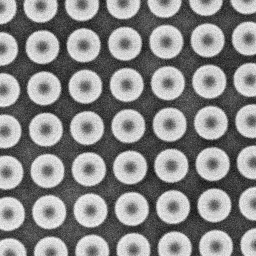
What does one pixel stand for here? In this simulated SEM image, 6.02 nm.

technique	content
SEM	an array of small figures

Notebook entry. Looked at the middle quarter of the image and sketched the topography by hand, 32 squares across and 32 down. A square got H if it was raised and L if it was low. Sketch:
LLLLLLLLLLLLLLLLLLLLLLLLLLLLLLLL
LLLLLLLLLLLLLLHHHLLLLLLLHHHHLLLL
LLLHHHHHLLLLLHHHHHHLLLLHHHHHHLLL
LLHHHHHHHLLLHHHHHHHLLLHHHHHHHHLL
LHHHHHHHHLLLHHHHHHHHLLHHHHHHHHLL
LHHHHHHHHLLLHHHHHHHHLLHHHHHHHHLL
LHHHHHHHHLLLHHHHHHHHLLHHHHHHHHLL
LLHHHHHHHLLLHHHHHHHLLLLHHHHHHLLL
LLHHHHHHLLLLLHHHHHLLLLLLHHHHLLLL
LLLLHHHLLLLLLLLLLLLLLLLLLLLLLLLL
LLLLLLLLLLLLLLLLLLLLLLLLLLLLLLLL
LLLLLLLLLLLLLLLLLLLLLLLLHHHHLLLL
LLLLHHHHLLLLLHHHHHHLLLLHHHHHHHLL
LLHHHHHHHLLLLHHHHHHHLLLHHHHHHHLL
LLHHHHHHHHLLHHHHHHHHLLHHHHHHHHLL
LLHHHHHHHHLLHHHHHHHHLLHHHHHHHHLL
LLHHHHHHHHLLHHHHHHHHLLLHHHHHHHLL
LLHHHHHHHHLLHHHHHHHHLLLHHHHHHHLL
LLLHHHHHHLLLLHHHHHHLLLLLHHHHHLLL
LLLLHHHHLLLLLLLHHLLLLLLLLLLLLLLL
LLLLLLLLLLLLLLLLLLLLLLLLLLLLLLLL
LLLLLLLLLLLLLLLLLLLLLLLLLLHHLLLL
LLLLLHHHLLLLLLHHHHHLLLLLHHHHHHLL
LLLHHHHHHLLLLHHHHHHHLLLHHHHHHHLL
LLLHHHHHHHLLLHHHHHHHLLLHHHHHHHHL
LLHHHHHHHHLLLHHHHHHHHLLHHHHHHHHL
LLHHHHHHHHLLLHHHHHHHHLLHHHHHHHHL
LLHHHHHHHHLLLHHHHHHHLLLHHHHHHHLL
LLLHHHHHHHLLLHHHHHHHLLLLHHHHHHLL
LLLLHHHHHLLLLLLHHHLLLLLLLLLLLLLL
LLLLLLLLLLLLLLLLLLLLLLLLLLLLLLLL
LLLLLLLLLLLLLLLLLLLLLLLLLLLLLLLL